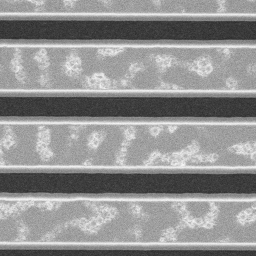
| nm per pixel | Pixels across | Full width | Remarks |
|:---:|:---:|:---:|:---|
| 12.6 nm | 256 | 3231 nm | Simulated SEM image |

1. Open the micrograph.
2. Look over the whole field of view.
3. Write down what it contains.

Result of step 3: one or a few lines or trenches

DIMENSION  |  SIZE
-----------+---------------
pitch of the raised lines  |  0.967 microns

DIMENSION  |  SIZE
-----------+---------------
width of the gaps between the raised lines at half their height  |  0.342 micrometres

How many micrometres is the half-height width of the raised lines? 0.62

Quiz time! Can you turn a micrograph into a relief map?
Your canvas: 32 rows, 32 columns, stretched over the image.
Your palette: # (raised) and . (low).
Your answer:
################################
################################
................................
................................
................................
####.###.#########.###..........
################################
################################
################################
################################
################################
################################
................................
................................
................................
################################
################################
################################
################################
################################
################################
................................
................................
................................
................................
################################
################################
################################
################################
################################
################################
................................